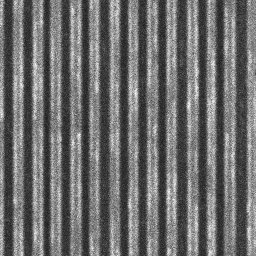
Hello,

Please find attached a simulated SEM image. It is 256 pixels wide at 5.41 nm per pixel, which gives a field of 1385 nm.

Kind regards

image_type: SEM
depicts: parallel lines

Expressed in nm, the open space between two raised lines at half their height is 48.7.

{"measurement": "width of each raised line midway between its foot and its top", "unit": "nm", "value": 54.1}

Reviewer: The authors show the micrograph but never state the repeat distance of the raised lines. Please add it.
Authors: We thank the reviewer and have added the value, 104 nm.